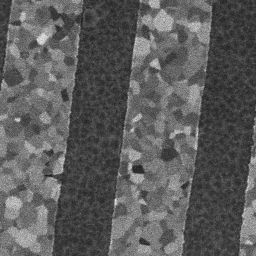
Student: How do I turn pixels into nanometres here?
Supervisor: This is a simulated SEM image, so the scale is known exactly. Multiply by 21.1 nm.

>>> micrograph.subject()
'one or a few lines or trenches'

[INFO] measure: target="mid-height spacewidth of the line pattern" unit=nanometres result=1180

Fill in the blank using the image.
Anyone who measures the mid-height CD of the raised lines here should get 1520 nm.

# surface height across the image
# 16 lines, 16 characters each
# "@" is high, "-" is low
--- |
-@@@@----@@@@---
-@@@@@--@@@@@---
@@@@@---@@@@@---
@@@@@---@@@@@---
@@@@@---@@@@@---
@@@@@---@@@@@---
@@@@----@@@@@---
@@@@----@@@@----
@@@@---@@@@@----
@@@@---@@@@@----
@@@@---@@@@@----
@@@@---@@@@@---@
@@@@---@@@@@---@
@@@----@@@@@---@
@@@----@@@@----@
@@@----@@@@@---@